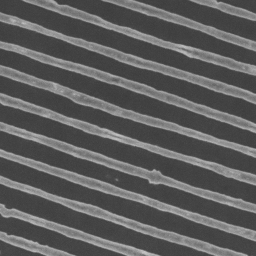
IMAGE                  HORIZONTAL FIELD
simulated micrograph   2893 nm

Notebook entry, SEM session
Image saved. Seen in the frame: parallel lines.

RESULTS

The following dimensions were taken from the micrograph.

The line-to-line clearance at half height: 199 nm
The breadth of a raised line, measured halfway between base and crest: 0.0994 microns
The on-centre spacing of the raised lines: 295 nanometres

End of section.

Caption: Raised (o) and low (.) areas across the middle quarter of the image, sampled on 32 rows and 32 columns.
oooooo...........ooooooooo......
.oooooooo............oooooooo...
.....ooooooo.............ooooooo
........ooooooo.............oooo
..........oooooooo.............o
..............ooooooo...........
oo...............oooooo.........
ooooo...............ooooooo.....
.ooooooo..............ooooooo...
...ooooooo...............ooooooo
......ooooooo...............oooo
.........ooooooo...............o
............ooooooo.............
o..............oooooooo.........
ooooo..............oooooooo.....
..oooooo..............ooooooo...
....ooooooo...............oooooo
.......ooooooo...............ooo
...........oooooo...............
..............ooooo.............
oo................ooooo.........
oooooo...............ooooo......
.oooooooo...............ooooo...
....oooooooo...............ooooo
........ooooooo...............oo
...........ooooooo..............
.............oooooooo...........
ooo.............oooooooo........
oooooo..............ooooooo.....
..oooooooo...........oooooooo...
.....oooooooo.............oooooo
........ooooooo...............oo